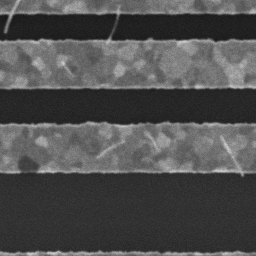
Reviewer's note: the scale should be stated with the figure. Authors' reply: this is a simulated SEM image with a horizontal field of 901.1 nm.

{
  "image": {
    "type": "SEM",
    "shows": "lines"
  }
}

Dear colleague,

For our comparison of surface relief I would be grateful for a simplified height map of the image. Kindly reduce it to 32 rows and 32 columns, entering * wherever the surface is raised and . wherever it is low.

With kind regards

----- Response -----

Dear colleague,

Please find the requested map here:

********************************
********************************
................................
................................
................................
********************************
********************************
********************************
********************************
********************************
********************************
................................
................................
................................
................................
.....*....****....*.********..*.
********************************
********************************
********************************
********************************
********************************
***.*.*.*.**.***..***...***..***
................................
................................
................................
................................
................................
................................
................................
................................
................................
................................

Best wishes